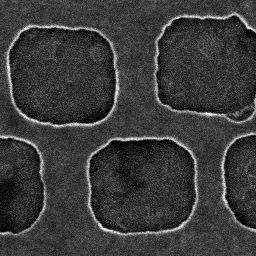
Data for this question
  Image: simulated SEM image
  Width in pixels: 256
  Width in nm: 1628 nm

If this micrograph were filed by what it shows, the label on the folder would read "holes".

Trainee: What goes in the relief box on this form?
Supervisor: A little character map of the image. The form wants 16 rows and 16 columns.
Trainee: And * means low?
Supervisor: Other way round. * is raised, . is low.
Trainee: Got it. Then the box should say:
****************
***********....*
*......***......
*......***......
*......***......
*......***......
*......***......
**....**********
***************.
..****......**..
...***......**..
...***......**..
...***......**..
..****......***.
.******...******
****************